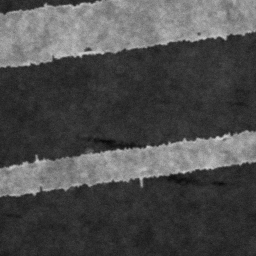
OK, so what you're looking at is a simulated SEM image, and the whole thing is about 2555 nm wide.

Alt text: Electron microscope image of one or a few lines or trenches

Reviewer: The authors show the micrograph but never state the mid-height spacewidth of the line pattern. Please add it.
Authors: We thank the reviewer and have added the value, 973 nanometres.